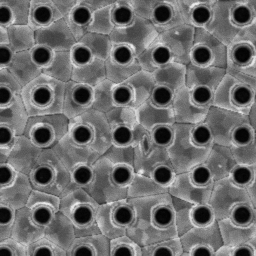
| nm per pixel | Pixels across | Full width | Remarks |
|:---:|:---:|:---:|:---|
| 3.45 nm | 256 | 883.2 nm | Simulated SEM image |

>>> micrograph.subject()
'a regular array of holes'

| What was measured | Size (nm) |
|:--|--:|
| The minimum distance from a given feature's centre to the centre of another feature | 136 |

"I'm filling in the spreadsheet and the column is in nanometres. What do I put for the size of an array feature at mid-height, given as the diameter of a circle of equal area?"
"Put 58.6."